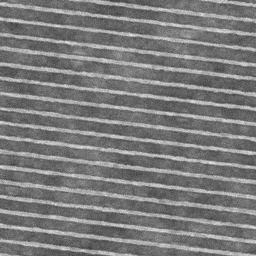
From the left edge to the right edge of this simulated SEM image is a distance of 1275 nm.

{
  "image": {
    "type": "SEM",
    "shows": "parallel lines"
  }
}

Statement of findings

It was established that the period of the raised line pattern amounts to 72.8 nanometers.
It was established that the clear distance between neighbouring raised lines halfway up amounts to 61.2 nm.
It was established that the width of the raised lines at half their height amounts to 2.85 pixels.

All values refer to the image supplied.